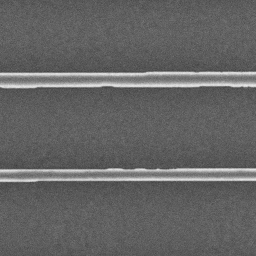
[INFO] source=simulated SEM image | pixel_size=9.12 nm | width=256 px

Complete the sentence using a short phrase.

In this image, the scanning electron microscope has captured lines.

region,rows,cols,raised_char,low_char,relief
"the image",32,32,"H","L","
LLLLLLLLLLLLLLLLLLLLLLLLLLLLLLLL
LLLLLLLLLLLLLLLLLLLLLLLLLLLLLLLL
LLLLLLLLLLLLLLLLLLLLLLLLLLLLLLLL
LLLLLLLLLLLLLLLLLLLLLLLLLLLLLLLL
LLLLLLLLLLLLLLLLLLLLLLLLLLLLLLLL
LLLLLLLLLLLLLLLLLLLLLLLLLLLLLLLL
LLLLLLLLLLLLLLLLLLLLLLLLLLLLLLLL
LLLLLLLLLLLLLLLLLLLLLLLLLLLLLLLL
LLLLLLLLLLLLLLLLLLLLLLLLLLLLLLLL
HHHHHHHHHHHHHHHHHHHHHHHHHHHHHHHH
HHHHHHHHHHHHHHHHHHHHHHHHHHHHHHHH
LLLLLLLLLLLLLLLLLLLLLLLLLLLLLLLL
LLLLLLLLLLLLLLLLLLLLLLLLLLLLLLLL
LLLLLLLLLLLLLLLLLLLLLLLLLLLLLLLL
LLLLLLLLLLLLLLLLLLLLLLLLLLLLLLLL
LLLLLLLLLLLLLLLLLLLLLLLLLLLLLLLL
LLLLLLLLLLLLLLLLLLLLLLLLLLLLLLLL
LLLLLLLLLLLLLLLLLLLLLLLLLLLLLLLL
LLLLLLLLLLLLLLLLLLLLLLLLLLLLLLLL
LLLLLLLLLLLLLLLLLLLLLLLLLLLLLLLL
LLLLLLLLLLLLLLLLLLLLLLLLLLLLLLLL
HHHHHHHHHHHHHHHHHHHHHHHHHHHHHHHH
HHHHHHHHHHHHHHHHHHHHHHHHHHHHHHHH
LLLLLLLLLLLLLLLLLLLLLLLLLLLLLLLL
LLLLLLLLLLLLLLLLLLLLLLLLLLLLLLLL
LLLLLLLLLLLLLLLLLLLLLLLLLLLLLLLL
LLLLLLLLLLLLLLLLLLLLLLLLLLLLLLLL
LLLLLLLLLLLLLLLLLLLLLLLLLLLLLLLL
LLLLLLLLLLLLLLLLLLLLLLLLLLLLLLLL
LLLLLLLLLLLLLLLLLLLLLLLLLLLLLLLL
LLLLLLLLLLLLLLLLLLLLLLLLLLLLLLLL
LLLLLLLLLLLLLLLLLLLLLLLLLLLLLLLL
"